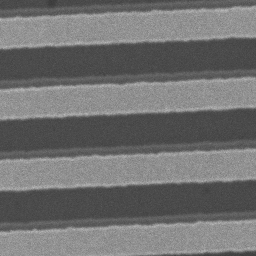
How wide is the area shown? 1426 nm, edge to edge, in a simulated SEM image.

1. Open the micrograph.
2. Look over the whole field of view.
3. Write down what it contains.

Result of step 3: lines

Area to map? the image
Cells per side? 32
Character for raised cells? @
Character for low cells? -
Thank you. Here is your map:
--------------------------------
-------------------@@@@@@@@@@@@@
@@@@@@@@@@@@@@@@@@@@@@@@@@@@@@@@
@@@@@@@@@@@@@@@@@@@@@@@@@@@@@@@@
@@@@@@@@@@@@@@@@@@@@@@@@@@@@@@@@
@@@@@@@@@@@@@@------------------
--------------------------------
--------------------------------
--------------------------------
--------------------------------
----------------@@@@@@@@@@@@@@@@
@@@@@@@@@@@@@@@@@@@@@@@@@@@@@@@@
@@@@@@@@@@@@@@@@@@@@@@@@@@@@@@@@
@@@@@@@@@@@@@@@@@@@@@@@@@@@@@@--
@@@@@@@@@-----------------------
--------------------------------
--------------------------------
--------------------------------
--------------------------------
-----------@-@@@@@@@@@@@@@@@@@@@
@@@@@@@@@@@@@@@@@@@@@@@@@@@@@@@@
@@@@@@@@@@@@@@@@@@@@@@@@@@@@@@@@
@@@@@@@@@@@@@@@@@@@@@@@@@@@@@@--
@@@@@@@@------------------------
--------------------------------
--------------------------------
--------------------------------
--------------------------------
--------@@@@@@@@@@@@@@@@@@@@@@@@
@@@@@@@@@@@@@@@@@@@@@@@@@@@@@@@@
@@@@@@@@@@@@@@@@@@@@@@@@@@@@@@@@
@@@@@@@@@@@@@@@@@@@@@@@@@@@@----